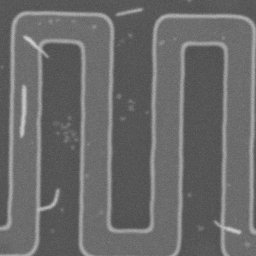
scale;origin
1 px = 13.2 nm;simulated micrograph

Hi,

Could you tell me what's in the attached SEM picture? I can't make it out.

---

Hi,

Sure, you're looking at groups of lines, slits or small figures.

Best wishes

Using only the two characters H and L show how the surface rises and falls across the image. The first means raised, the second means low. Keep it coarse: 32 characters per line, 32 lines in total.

LLLLLLLLLLLLLLLLLLLLLLLLLLLLLLLL
LLLLLLLLLLLLLLLLLLLLLLLLLLLLLLLL
LLHHHHHHHHHHHHLLLLLLHHHHHHHHHHHL
LLHHHHHHHHHHHHLLLLLHHHHHHHHHHHHH
LLHHHHHHHHHHHHLLLLLHHHHHHHHHHHHH
LLHHHLLLLLHHHHLLLLLHHHHHLLLHHHHH
LLHHHLLLLLHHHHLLLLLHHHHLLLLLHHHH
LLHHHLLLLLHHHHLLLLLHHHHLLLLLHHHH
LLHHHLLLLLHHHHLLLLLHHHHLLLLLHHHH
LLHHHLLLLLHHHHLLLLLHHHHLLLLLHHHH
LLHHHLLLLLHHHHLLLLLHHHHLLLLLHHHH
LHHHHLLLLLHHHHLLLLLHHHHLLLLLHHHH
LHHHHLLLLLHHHHLLLLLHHHHLLLLLHHHH
LHHHHLLLLLHHHHLLLLLHHHHLLLLLHHHH
LHHHHLLLLLHHHHLLLLLHHHHLLLLLHHHH
LHHHHLLLLLHHHHLLLLLHHHHLLLLLHHHH
LHHHHLLLLLHHHHLLLLLHHHHLLLLLHHHH
LHHHHLLLLLHHHHLLLLLHHHHLLLLLHHHH
LHHHHLLLLLHHHHLLLLLHHHHLLLLLHHHL
LHHHHLLLLLHHHHLLLLLHHHHLLLLLHHHL
LHHHHLLLLLHHHHLLLLLHHHHLLLLLHHHL
LHHHHLLLLLHHHHLLLLLHHHHLLLLLHHHL
LHHHHLLLLLHHHHLLLLLHHHHLLLLLHHHL
LHHHHLLLLLHHHHLLLLLHHHHLLLLLHHHL
LHHHHLLLLLHHHHLLLLLHHHHLLLLLHHHL
LHHHHLLLLLHHHHLLLLLHHHHLLLLLHHHL
LHHHHLLLLLHHHHLLLLLHHHHLLLLLHHHL
LHHHHLLLLLHHHHLLLLLHHHLLLLLLHHHL
HHHHHLLLLLHHHHLLLLLHHHLLLLLLHHHH
HHHHHLLLLLHHHHHHHHHHHHLLLLLLHHHH
HHHHHLLLLLHHHHHHHHHHHHLLLLLLHHHH
HHHHLLLLLLLHHHHHHHHHHHLLLLLLHHHH